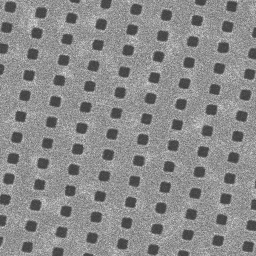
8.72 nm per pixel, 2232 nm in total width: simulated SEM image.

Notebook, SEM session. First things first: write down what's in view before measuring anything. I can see a regular array of holes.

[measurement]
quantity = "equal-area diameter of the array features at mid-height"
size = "104 nanometers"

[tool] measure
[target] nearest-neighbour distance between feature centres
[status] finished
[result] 184 nm